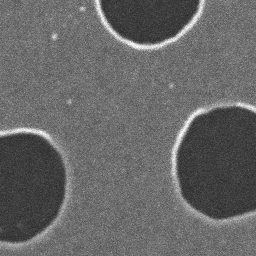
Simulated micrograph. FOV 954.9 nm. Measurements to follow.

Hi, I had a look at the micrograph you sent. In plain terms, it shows holes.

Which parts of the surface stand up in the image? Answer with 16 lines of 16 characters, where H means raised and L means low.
HHHHHHLLLLLLHHHH
HHHHHHHLLLLLHHHH
HHHHHHHHLLLHHHHH
HHHHHHHHHHHHHHHH
HHHHHHHHHHHHHHHH
HHHHHHHHHHHHHHHH
HHHHHHHHHHHHHHHH
HHHHHHHHHHHHLLLL
LLLHHHHHHHHLLLLL
LLLLHHHHHHHLLLLL
LLLLHHHHHHHLLLLL
LLLLHHHHHHHLLLLL
LLLLHHHHHHHHLLLL
LLLLHHHHHHHHHLLH
LLLHHHHHHHHHHHHH
HHHHHHHHHHHHHHHH